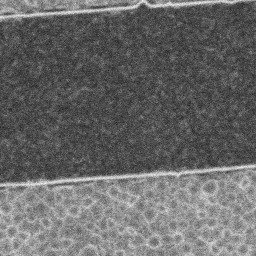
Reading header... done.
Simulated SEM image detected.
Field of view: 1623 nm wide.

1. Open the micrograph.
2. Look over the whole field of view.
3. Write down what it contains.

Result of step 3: one or a few lines or trenches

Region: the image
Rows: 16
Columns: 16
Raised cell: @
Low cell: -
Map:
--------@@@@@@@@
@@@@@@@@@@@@@@@@
@@@@@@@@@@@@@@@@
@@@@@@@@@@@@@@@@
@@@@@@@@@@@@@@@@
@@@@@@@@@@@@@@@@
@@@@@@@@@@@@@@@@
@@@@@@@@@@@@@@@@
@@@@@@@@@@@@@@@@
@@@@@@@@@@@@@@@@
@@@@@@@@@@@@@@@-
@@--------------
----------------
----------------
----------------
----------------